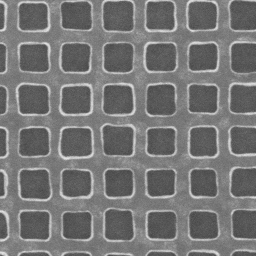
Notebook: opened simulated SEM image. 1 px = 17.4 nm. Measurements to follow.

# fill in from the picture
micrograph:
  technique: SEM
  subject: a regular array of holes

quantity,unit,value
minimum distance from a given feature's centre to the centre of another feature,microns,0.72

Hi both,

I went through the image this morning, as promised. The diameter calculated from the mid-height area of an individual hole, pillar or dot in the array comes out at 566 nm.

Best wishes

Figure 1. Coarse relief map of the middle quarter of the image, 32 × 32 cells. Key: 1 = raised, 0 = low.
00000011110000000111000000001110
00000011110000000111100000011111
11111111111111111111111111111111
11111111111111111111111111111111
11111111111111111111111111111111
00000011110000000111110000011110
00000001110000000111100000001110
00000001110000000111100000001110
00000001110000000111100000001110
00000001110000000111100000001110
00000001110000000111100000001110
00000001110000000111100000001110
00000111111000000111100000011111
11111111111111111111111111111111
11111111111111111111111111111111
11111111110000000111111111111111
00000001100000000011100000001111
00000001100000000011100000001110
00000001100000000011100000001110
00000001110000000111100000001110
00000001110000000111100000001110
00000001110000000111100000001110
00000001110000000111100000011111
11111111111111111111111111111111
11111111111111111111111111111111
11111111111111111111111111111111
00001111111000001111100000011111
00000001110000000111000000001110
00000001110000000111000000001110
00000001110000000111000000001110
00000001110000000111000000001111
00000001110000000111000000001111